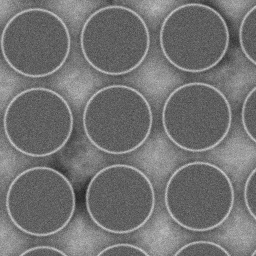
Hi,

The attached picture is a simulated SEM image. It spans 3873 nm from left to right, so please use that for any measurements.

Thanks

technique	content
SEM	an array of small figures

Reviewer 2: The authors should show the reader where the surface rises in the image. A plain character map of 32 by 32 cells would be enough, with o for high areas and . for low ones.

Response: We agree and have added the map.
................................
...ooo......ooooo.....ooooo....o
.ooooooo...ooooooo...ooooooo..oo
.ooooooo..oooooooo..oooooooo..oo
ooooooooo.ooooooooo.ooooooooo.oo
ooooooooo.ooooooooo.oooooooo..oo
ooooooooo.oooooooo..oooooooo...o
.ooooooo...ooooooo...oooooo....o
..ooooo.....ooooo.....oooo......
....o...........................
........................o.......
...oooo.....ooooo.....ooooo....o
..oooooo...ooooooo...ooooooo...o
.oooooooo..oooooooo.ooooooooo.oo
.oooooooo..oooooooo.ooooooooo.oo
.oooooooo..oooooooo..oooooooo..o
.oooooooo..oooooooo..ooooooo...o
.ooooooo...ooooooo...ooooooo....
..ooooo.....ooooo......ooo......
................................
........................oo......
...oooo.....oooooo....oooooo....
..oooooo....oooooo...oooooooo..o
.oooooooo..oooooooo..oooooooo..o
.oooooooo..oooooooo..oooooooo..o
.oooooooo..oooooooo..oooooooo..o
.oooooooo..oooooooo..oooooooo..o
..ooooooo...oooooo....oooooo....
...ooooo.....oooo......ooo......
................................
........................ooo.....
...ooooo.....ooooo....oooooo....